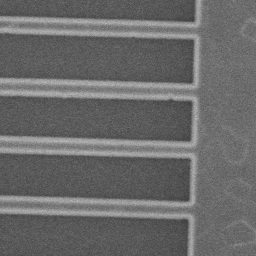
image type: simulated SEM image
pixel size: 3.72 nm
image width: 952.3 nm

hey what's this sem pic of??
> parallel lines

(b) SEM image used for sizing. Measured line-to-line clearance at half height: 0.167 micrometres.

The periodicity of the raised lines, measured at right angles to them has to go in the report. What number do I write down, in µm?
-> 0.223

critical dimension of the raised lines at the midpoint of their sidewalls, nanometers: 54.4